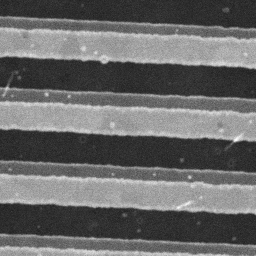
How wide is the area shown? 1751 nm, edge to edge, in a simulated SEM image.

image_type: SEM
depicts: lines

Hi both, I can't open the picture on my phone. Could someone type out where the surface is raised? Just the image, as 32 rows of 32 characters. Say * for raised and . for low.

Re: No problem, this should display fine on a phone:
................................
................................
*******.*.......................
******************************..
********************************
********************************
********************************
..........*.********************
...............................*
................................
................................
*********.......................
********************************
********************************
********************************
********************************
.........***********************
.............................***
................................
................................
*******.........................
*******************************.
********************************
********************************
********************************
.......*************************
..........................******
................................
................................
*****...........................
*****************************...
********************************